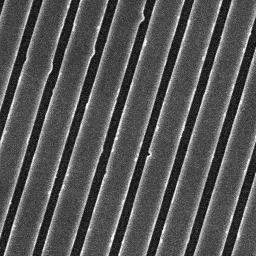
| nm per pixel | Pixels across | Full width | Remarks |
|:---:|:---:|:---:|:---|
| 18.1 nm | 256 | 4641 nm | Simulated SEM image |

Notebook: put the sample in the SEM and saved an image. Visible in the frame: parallel lines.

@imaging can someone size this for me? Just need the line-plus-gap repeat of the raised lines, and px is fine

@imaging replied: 36.3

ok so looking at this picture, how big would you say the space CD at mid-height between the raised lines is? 0.178 µm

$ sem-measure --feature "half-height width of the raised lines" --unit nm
484